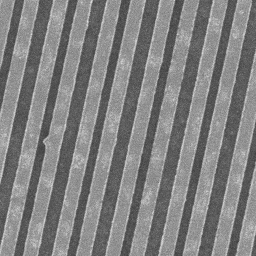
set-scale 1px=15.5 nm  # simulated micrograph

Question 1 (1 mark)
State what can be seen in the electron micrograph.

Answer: parallel lines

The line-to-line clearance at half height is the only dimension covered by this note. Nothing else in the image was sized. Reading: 167 nanometres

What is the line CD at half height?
211 nm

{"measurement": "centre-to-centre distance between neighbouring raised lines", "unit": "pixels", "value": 26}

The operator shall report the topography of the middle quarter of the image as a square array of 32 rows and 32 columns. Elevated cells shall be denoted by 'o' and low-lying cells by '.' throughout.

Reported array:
oooo...oooo..oooo....ooo...ooo..
ooo....oooo..oooo...oooo..oooo..
ooo....ooo...ooo....oooo..oooo..
ooo....ooo...ooo....ooo...ooo...
ooo...oooo..oooo....ooo...ooo...
oo....oooo..oooo...oooo...ooo...
oo....ooo...ooo....oooo..oooo...
oo....ooo...ooo....oooo..oooo...
oo....ooo...ooo....ooo...ooo....
o....oooo..oooo....ooo...ooo....
o....oooo..oooo...oooo...ooo....
o....ooo...ooo....oooo..oooo....
o....ooo...ooo....oooo..oooo...o
o....ooo...ooo....ooo...ooo....o
o...oooo..oooo....ooo...ooo....o
....oooo..ooo....oooo..oooo....o
....ooo...ooo....oooo..oooo...oo
....ooo...ooo....ooo...ooo....oo
....ooo..oooo....ooo...ooo....oo
...oooo..oooo...oooo...ooo....oo
...ooo...oooo...oooo..oooo....oo
...ooo...ooo....oooo..oooo...ooo
...ooo...ooo....ooo...ooo....ooo
..oooo..oooo....ooo...ooo....ooo
..oooo..oooo...oooo...ooo....ooo
..ooo...ooo....oooo..oooo....ooo
..ooo...ooo....ooo...oooo...oooo
.oooo...ooo....ooo...ooo....oooo
.oooo..oooo....ooo...ooo....ooo.
.oooo..ooo....oooo..oooo....ooo.
.ooo...ooo....oooo..oooo...oooo.
oooo...ooo....ooo...ooo....oooo.